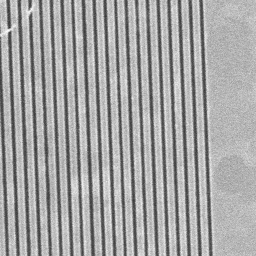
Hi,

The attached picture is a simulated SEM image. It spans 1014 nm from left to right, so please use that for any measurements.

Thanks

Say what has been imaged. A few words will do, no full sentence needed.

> parallel lines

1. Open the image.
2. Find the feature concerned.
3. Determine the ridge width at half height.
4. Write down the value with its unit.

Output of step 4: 25.3 nm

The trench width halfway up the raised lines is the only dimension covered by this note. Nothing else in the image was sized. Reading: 18.3 nm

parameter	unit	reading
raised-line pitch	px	10.7